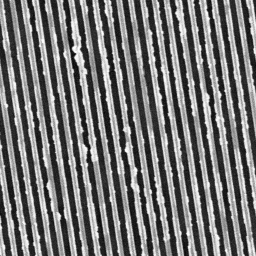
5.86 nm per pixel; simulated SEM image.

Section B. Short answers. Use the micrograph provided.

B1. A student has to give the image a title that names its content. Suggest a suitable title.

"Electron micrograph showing parallel lines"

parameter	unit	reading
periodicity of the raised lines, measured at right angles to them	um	0.0689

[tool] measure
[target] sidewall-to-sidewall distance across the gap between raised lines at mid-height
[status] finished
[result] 37.7 nm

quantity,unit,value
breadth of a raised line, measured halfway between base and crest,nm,31.9